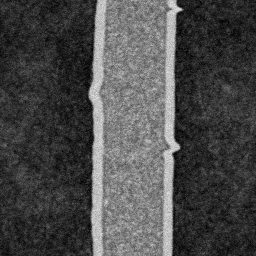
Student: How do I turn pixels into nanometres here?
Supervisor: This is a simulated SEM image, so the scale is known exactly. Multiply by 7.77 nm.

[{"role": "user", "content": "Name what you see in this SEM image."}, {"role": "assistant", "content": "one or a few lines or trenches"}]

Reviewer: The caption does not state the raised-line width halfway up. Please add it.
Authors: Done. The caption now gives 555 nm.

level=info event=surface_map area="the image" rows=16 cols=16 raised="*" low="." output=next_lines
......*****.....
......*****.....
......*****.....
......*****.....
......*****.....
......*****.....
......*****.....
......*****.....
......*****.....
......*****.....
......*****.....
......****......
......*****.....
......****......
......****......
......****......